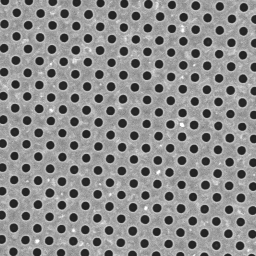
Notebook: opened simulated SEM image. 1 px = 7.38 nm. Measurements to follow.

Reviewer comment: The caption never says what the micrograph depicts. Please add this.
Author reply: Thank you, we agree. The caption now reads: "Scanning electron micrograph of a regular array of holes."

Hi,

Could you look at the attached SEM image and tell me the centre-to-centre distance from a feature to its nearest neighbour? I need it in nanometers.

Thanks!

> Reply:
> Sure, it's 123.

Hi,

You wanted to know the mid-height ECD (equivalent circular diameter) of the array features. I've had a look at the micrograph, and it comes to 64.5 nanometres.